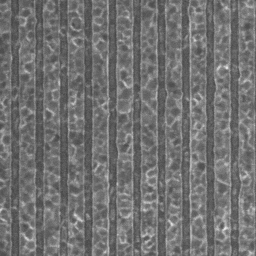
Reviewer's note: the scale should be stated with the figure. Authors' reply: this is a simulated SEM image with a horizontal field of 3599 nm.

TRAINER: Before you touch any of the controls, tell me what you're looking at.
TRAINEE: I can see parallel lines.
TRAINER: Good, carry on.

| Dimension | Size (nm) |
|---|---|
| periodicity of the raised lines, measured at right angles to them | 343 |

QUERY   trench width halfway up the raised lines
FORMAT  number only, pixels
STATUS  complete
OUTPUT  8.5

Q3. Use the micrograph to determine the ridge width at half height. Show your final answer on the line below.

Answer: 217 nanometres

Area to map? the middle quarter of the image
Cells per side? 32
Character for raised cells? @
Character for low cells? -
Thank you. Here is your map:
-@@@@--@@@@--@@@@--@@@@---@@@---
-@@@@--@@@@--@@@@--@@@@---@@@---
-@@@@--@@@@--@@@@--@@@@---@@@---
-@@@@--@@@@--@@@@--@@@@--@@@@---
-@@@@--@@@@--@@@@--@@@@--@@@@---
-@@@@--@@@@--@@@@--@@@@---@@@---
-@@@@--@@@@--@@@@--@@@@---@@@---
-@@@@--@@@@--@@@@--@@@@---@@@@--
-@@@@--@@@@--@@@@--@@@@---@@@---
-@@@@--@@@@--@@@@--@@@@---@@@---
-@@@@--@@@@--@@@@-@@@@@---@@@---
-@@@@--@@@@--@@@@--@@@@--@@@@---
-@@@@--@@@@--@@@@--@@@@--@@@@---
-@@@@--@@@@--@@@@--@@@@--@@@@---
-@@@@--@@@@--@@@@--@@@@---@@@---
-@@@@--@@@@--@@@@--@@@@--@@@@---
-@@@@--@@@@--@@@@--@@@@--@@@@---
-@@@@--@@@@--@@@@--@@@@--@@@@---
-@@@@--@@@@--@@@@--@@@@---@@@---
-@@@@--@@@@--@@@@--@@@@---@@@---
-@@@@--@@@@--@@@@--@@@@---@@@---
-@@@@--@@@@--@@@@--@@@@---@@@---
-@@@@--@@@@---@@@--@@@@---@@@---
-@@@@--@@@@---@@@--@@@@---@@@---
-@@@@--@@@@--@@@@--@@@@--@@@@---
-@@@@--@@@@--@@@@--@@@@--@@@@---
-@@@@--@@@@--@@@@--@@@@--@@@@---
-@@@@--@@@@--@@@@--@@@@--@@@@---
-@@@@--@@@@--@@@@--@@@@--@@@@---
-@@@@--@@@@--@@@@--@@@@---@@@---
-@@@@--@@@@--@@@@--@@@@---@@@---
-@@@@--@@@@--@@@@--@@@@--@@@@---